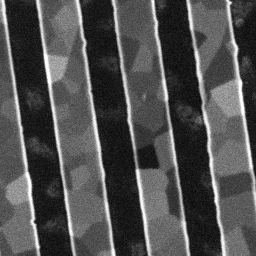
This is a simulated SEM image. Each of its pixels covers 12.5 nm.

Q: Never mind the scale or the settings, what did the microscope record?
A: one or a few lines or trenches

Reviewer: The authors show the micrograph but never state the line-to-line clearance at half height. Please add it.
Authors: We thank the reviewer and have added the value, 431 nanometres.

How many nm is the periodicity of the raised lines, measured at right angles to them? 928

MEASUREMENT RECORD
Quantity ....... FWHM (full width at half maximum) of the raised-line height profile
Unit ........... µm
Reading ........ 0.492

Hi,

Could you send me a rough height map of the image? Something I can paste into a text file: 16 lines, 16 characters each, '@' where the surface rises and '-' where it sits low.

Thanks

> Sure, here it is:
--@@@--@@@--@@--
---@@--@@@--@@--
@--@@--@@@--@@@-
@--@@---@@--@@@-
@--@@---@@--@@@-
@--@@@--@@---@@-
@--@@@--@@---@@-
@--@@@--@@@--@@-
@---@@--@@@--@@-
@@--@@--@@@--@@@
@@--@@---@@--@@@
@@--@@@--@@--@@@
@@--@@@--@@---@@
@@--@@@--@@---@@
@@--@@@--@@@--@@
@@---@@--@@@--@@